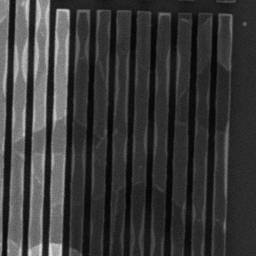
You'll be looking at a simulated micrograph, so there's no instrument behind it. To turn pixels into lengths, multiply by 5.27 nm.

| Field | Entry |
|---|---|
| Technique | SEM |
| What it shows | groups of lines, slits or small figures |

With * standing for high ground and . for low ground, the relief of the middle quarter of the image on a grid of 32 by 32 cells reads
*..***..***..***..***..***...**.
*..***..***..***..***..***...**.
*..***..***..***..***..***..***.
*..***..***..***..***..***..***.
*..***..***..***..***..***..***.
*..***..***..***..***..***..***.
*..***..***..***..***..***..***.
*..***..***..***..***..***..***.
*..***..***..***..***..***..***.
*..***..***..***..***..***..***.
*..***..***..***..***..***..***.
...**...***..**...***..***..***.
...**...***..**...***..***..***.
..***...***..**...***..***..***.
..***..****..***..***..***..***.
..***..****..***..***..***..***.
..***..****.****..***..***..***.
..***..****.****.****..***..***.
..***..****.****.***...***..***.
..***..****.***...**...***..***.
..***..****.***..***...**...***.
..***..***..***..***...**...***.
..***..***..***..****..***.****.
..***..***..***..****..***.****.
..***..***..***..****.***..****.
..***..***..***..***..***..****.
..***..***..***..***..***..****.
..***..***..***..***..***..****.
..***..***..***..***..***..****.
..***..***..***..***..***..****.
..***..***..***..***..***..****.
..***..***..***..***..***..****.